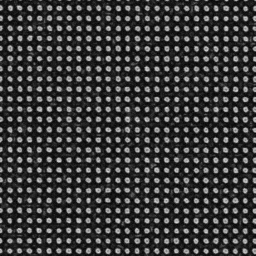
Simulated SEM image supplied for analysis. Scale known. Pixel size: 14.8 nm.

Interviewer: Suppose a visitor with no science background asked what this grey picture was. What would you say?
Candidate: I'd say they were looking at a regular array of raised bodies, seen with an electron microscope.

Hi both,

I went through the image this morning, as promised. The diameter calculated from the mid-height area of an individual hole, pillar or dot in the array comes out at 4.52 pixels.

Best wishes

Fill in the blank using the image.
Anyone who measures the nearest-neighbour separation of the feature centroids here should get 143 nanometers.